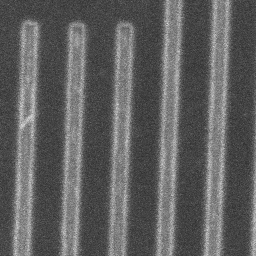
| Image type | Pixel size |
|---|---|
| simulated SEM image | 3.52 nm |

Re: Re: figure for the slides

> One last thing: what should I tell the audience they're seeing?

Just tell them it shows parallel lines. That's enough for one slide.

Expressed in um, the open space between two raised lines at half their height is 0.0369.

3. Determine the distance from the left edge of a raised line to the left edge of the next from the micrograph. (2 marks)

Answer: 0.168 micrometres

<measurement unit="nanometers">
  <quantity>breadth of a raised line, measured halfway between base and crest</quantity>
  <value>132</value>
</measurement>